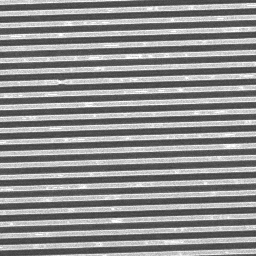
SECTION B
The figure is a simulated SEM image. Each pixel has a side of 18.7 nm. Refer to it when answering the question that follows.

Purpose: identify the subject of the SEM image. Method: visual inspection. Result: parallel lines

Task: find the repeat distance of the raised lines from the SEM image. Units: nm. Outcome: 218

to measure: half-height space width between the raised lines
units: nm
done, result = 112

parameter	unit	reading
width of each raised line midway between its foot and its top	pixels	6